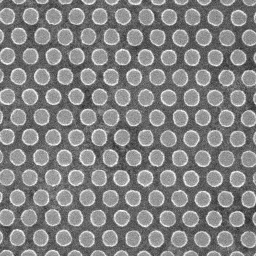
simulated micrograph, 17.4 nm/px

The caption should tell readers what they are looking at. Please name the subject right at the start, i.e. a regular array of raised bodies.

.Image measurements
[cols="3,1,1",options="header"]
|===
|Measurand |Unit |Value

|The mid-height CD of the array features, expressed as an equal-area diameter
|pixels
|15.7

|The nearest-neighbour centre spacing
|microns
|0.398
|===